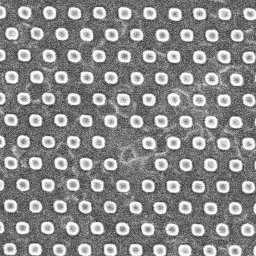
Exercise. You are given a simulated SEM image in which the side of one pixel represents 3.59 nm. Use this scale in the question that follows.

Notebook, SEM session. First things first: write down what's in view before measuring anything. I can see a regular array of raised bodies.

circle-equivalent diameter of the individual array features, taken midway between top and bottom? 0.0417 microns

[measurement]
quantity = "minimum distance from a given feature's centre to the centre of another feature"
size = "87.9 nm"